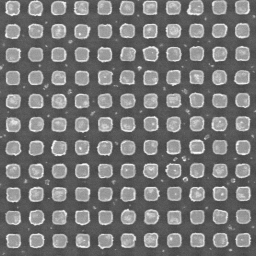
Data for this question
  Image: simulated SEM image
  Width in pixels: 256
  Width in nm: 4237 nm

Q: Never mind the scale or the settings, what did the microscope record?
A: a regular array of raised bodies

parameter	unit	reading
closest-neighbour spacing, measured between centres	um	0.377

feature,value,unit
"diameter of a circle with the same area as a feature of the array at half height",250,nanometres